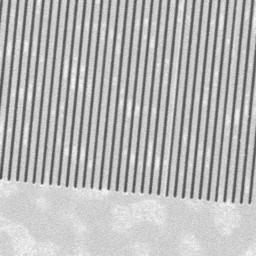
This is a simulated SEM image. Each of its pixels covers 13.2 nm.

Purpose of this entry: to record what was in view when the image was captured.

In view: parallel lines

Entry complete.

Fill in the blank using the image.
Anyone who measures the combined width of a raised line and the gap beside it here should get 110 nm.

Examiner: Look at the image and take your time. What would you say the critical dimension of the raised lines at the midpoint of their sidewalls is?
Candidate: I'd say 0.0758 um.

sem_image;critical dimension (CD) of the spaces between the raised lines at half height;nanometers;37.9